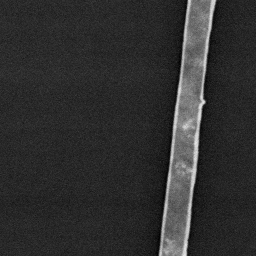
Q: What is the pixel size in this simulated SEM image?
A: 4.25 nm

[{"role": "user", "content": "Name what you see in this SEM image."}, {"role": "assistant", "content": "one or a few lines or trenches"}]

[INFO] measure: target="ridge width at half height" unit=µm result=0.103